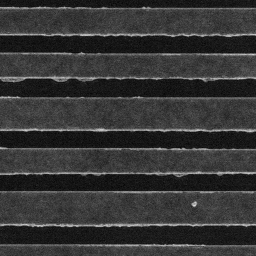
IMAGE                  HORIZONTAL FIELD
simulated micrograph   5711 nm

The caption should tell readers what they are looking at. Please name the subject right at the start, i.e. lines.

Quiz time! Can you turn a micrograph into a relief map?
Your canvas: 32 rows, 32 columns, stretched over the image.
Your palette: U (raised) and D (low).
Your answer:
DDDDDDDDDDDDDDDDDDDDDDDDDDDDDDDD
UUUUUUUUUUUUUUUUUUUUUUUUUUUUUUUU
UUUUUUUUUUUUUUUUUUUUUUUUUUUUUUUU
UUUUUUUUUUUUUUUUUUUUUUUUUUUUUUUU
DDDDDDDDDDDDDDDDDDDDDDDDDDDDDDDD
DDDDDDDDDDDDDDDDDDDDDDDDDDDDDDDD
DDDDDDDDDDDDDDDDDDDDDDDDDDDDDDDD
UUUUUUUUUUUUUUUUUUUUUUUUUUUUUUUU
UUUUUUUUUUUUUUUUUUUUUUUUUUUUUUUU
UUUUUUUUUUUUUUUUUUUUUUUUUUUUUUUU
DDDDDDDDDDDDDDDDDDDDDDDDDDDDDDDD
DDDDDDDDDDDDDDDDDDDDDDDDDDDDDDDD
UUUUUUUUUUUUUUUUUUUUUUUUUUUUUUUU
UUUUUUUUUUUUUUUUUUUUUUUUUUUUUUUU
UUUUUUUUUUUUUUUUUUUUUUUUUUUUUUUU
UUUUUUUUUUUUUUUUUUUUUUUUUUUUUUUU
DDDDDDDDDDDDDDDDDDDDDDDDDDDDDDDD
DDDDDDDDDDDDDDDDDDDDDDDDDDDDDDDD
DDDDDDDDDDDDDDDDDDDDDDDDDDDDDDDD
UUUUUUUUUUUUUUUUUUUUUUUUUUUUUUUU
UUUUUUUUUUUUUUUUUUUUUUUUUUUUUUUU
UUUUUUUUUUUUUUUUUUUUUUUUUUUUUUUU
DDDDDDDDDDDDDDDDDDDDDDDDDDDDDDDD
DDDDDDDDDDDDDDDDDDDDDDDDDDDDDDDD
UUUUUUUUUUUUUUUUUUUUUUUUUUUUUUUU
UUUUUUUUUUUUUUUUUUUUUUUUUUUUUUUU
UUUUUUUUUUUUUUUUUUUUUUUUUUUUUUUU
UUUUUUUUUUUUUUUUUUUUUUUUUUUUUUUU
DDDDDDDDDDDDDDDDDDDDDDDDDDDDDDDD
DDDDDDDDDDDDDDDDDDDDDDDDDDDDDDDD
DDDDDDDDDDDDDDDDDDDDDDDDDDDDDDDD
UUUUUUUUUUUUUUUUUUUUUUUUUUUUUUUU